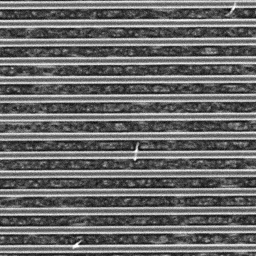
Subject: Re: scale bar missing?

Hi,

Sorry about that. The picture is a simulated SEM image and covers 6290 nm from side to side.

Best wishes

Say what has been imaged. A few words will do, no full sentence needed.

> parallel lines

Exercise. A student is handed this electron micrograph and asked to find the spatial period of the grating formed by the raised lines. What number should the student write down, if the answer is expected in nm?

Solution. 461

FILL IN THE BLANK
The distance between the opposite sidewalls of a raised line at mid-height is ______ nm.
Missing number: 166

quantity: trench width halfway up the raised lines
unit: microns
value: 0.286